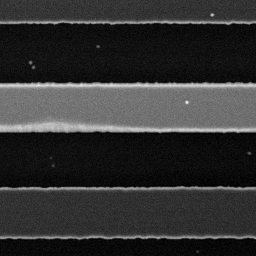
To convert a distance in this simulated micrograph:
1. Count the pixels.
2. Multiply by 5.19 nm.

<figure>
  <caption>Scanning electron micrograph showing lines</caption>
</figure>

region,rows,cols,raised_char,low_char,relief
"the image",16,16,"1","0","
1111111111111111
0000000000000000
0000000000000000
0000000000000000
0000000000000000
1111111111111111
1111111111111111
1111111111111111
0000000000000000
0000000000000000
0000000000000000
0000000000000000
1111111111111111
1111111111111111
1111111111111111
0000000000000000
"